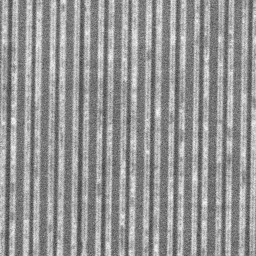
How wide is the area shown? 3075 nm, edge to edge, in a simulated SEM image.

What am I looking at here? parallel lines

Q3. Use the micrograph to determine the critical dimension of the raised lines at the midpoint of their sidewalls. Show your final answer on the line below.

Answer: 55.5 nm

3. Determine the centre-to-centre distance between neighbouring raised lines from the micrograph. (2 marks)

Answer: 144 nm